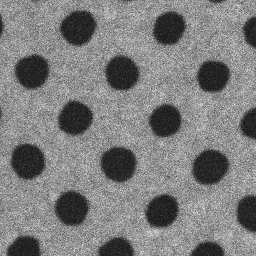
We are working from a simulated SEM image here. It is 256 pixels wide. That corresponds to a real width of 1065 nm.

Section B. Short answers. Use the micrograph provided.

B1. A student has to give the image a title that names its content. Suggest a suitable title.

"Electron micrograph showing a regular array of holes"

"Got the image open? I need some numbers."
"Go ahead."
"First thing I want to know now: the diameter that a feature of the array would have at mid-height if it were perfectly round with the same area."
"34.2 px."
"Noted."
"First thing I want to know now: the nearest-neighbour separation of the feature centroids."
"63.8 pixels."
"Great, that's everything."